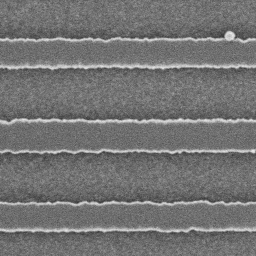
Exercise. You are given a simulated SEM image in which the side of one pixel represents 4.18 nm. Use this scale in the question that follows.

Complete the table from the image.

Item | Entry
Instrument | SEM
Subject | lines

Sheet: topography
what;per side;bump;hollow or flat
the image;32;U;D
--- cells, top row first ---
DDDDDDDDDDDDDDDDDDDDDDDDDDDDDDDD
DDDDDDDDDDDDDDDDDDDDDDDDDDDDDDDD
DDDDDDDDDDDDDDDDDDDDDDDDDDDDDDDD
DDDDDDDDDDDDDDDDDDDDDDDDDDDDDDDD
DDDDDDDDDDDDDDDDDDDDDDDDDDDDUDDD
UUUUUUUUUUUUUUUUUUUUUUUUUUUUUUUU
UUUUUUUUUUUUUUUUUUUUUUUUUUUUUUUU
UUUUUUUUUUUUUUUUUUUUUUUUUUUUUUUU
DUUDDDUDDDDDDDDDDDDDUDDDDDDDDDDD
DDDDDDDDDDDDDDDDDDDDDDDDDDDDDDDD
DDDDDDDDDDDDDDDDDDDDDDDDDDDDDDDD
DDDDDDDDDDDDDDDDDDDDDDDDDDDDDDDD
DDDDDDDDDDDDDDDDDDDDDDDDDDDDDDDD
DDDDDDDDDDDDDDDDDDDDDDDDDDDDDDDD
DDDDDDDDDDDDDDDDDDDDDDDDDDDDDDDD
UUUUUUUUUUUUUUUUUUUUUUUUUUUUUUUU
UUUUUUUUUUUUUUUUUUUUUUUUUUUUUUUU
UUUUUUUUUUUUUUUUUUUUUUUUUUUUUUUU
UUUUUUUUUUUUUUUUUUUUUUUUUUUUUUUU
DDDDDDDDDDDDDDDDDDDDDDDDDDDDDDDD
DDDDDDDDDDDDDDDDDDDDDDDDDDDDDDDD
DDDDDDDDDDDDDDDDDDDDDDDDDDDDDDDD
DDDDDDDDDDDDDDDDDDDDDDDDDDDDDDDD
DDDDDDDDDDDDDDDDDDDDDDDDDDDDDDDD
DDDDDDDDDDDDDDDDDDDDDDDDDDDDDDDD
UUUUUUUUUUUUUUUUUUUUUUUUUUUUUUUU
UUUUUUUUUUUUUUUUUUUUUUUUUUUUUUUU
UUUUUUUUUUUUUUUUUUUUUUUUUUUUUUUU
UUUUUUUUUUUUUUUUUUUUUUUUUUUUUUUU
DDDDDDDDDDDDDDDDDDDDDDDDDDDDDDDD
DDDDDDDDDDDDDDDDDDDDDDDDDDDDDDDD
DDDDDDDDDDDDDDDDDDDDDDDDDDDDDDDD